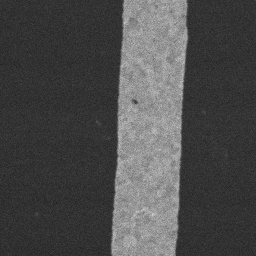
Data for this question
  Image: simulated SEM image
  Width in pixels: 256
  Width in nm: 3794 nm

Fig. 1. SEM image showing one or a few lines or trenches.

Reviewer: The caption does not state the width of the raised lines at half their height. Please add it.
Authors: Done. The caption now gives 916 nm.